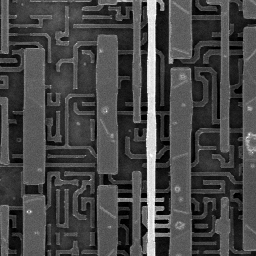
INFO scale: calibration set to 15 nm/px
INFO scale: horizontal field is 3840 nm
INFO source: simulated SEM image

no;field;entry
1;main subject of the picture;wiring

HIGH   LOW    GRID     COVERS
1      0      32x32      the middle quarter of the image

00000000111110000110011000000000
00000000111110000110011000011111
00000000111110000110011000011111
00000000111110000110011000011111
00000000111110000110011000011111
00000000111110000110011000011111
00000000111110000110011000011111
00000000111110000110011000011111
00000000111110000010011000011111
00000000111110000010011000011111
00000000111110000010011000011111
00000000111110000010011000011111
00000000111110000010011000011111
00000000111110000010011000011111
00000000111110000010011000011111
00000000111110000000011000011111
00000000111110000000011000011111
00000000111110000000011000011111
00000000111110000000011000011111
00000000111110000000011000011111
00000000111110000000011000011111
00000000111110000000011000011111
00000000111110000000011000011111
00000000111110000000011000011111
00000000111110000000011000011111
00000000111110000000011000011111
00000000111110000000011000011111
00000000000010000110011000011111
00000000000000000110011000011111
00000000000000000110011000011111
00000000001110000110011000011111
00000000111110000110011000011111